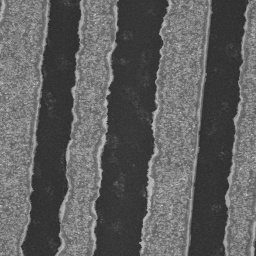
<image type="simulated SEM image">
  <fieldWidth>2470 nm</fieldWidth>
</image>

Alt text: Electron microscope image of one or a few lines or trenches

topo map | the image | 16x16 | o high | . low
ooo..oo....oo..o
ooo..oo...ooo..o
ooo..oo...ooo..o
ooo..oo...ooo..o
ooo..oo...ooo..o
ooo..oo...ooo..o
oo...oo...ooo..o
oo...oo...oo...o
oo..ooo...oo...o
oo..oo....oo...o
oo..oo...ooo...o
oo..oo...ooo..oo
oo..oo...ooo..oo
oo..oo...ooo..oo
oo..oo...ooo..oo
o...oo...ooo..oo